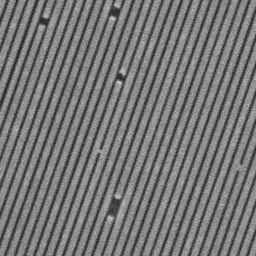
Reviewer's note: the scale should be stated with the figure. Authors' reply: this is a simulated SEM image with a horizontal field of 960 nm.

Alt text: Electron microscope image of parallel lines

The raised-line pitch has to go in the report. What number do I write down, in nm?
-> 34.3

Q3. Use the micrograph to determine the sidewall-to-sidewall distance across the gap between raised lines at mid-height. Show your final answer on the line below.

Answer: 9.7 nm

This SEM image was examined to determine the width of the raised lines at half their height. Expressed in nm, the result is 25.2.